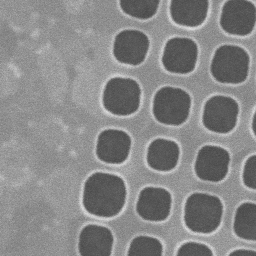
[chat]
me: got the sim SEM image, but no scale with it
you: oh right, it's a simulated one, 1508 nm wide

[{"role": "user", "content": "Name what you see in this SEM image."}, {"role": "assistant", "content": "a regular array of holes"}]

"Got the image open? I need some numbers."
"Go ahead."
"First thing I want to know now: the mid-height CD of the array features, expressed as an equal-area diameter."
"228 nm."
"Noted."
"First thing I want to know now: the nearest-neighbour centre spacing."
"292 nanometres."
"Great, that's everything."